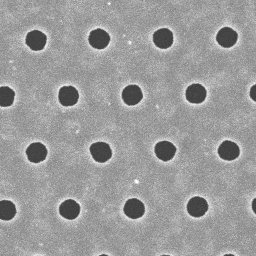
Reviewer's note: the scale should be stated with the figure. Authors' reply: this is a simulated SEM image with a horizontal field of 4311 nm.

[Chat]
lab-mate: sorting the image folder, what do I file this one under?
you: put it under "a regular array of holes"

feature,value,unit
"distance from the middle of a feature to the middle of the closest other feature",1070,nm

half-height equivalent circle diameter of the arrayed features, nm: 365